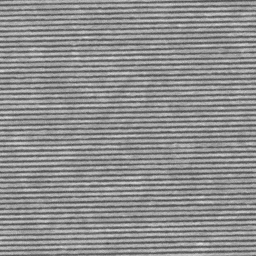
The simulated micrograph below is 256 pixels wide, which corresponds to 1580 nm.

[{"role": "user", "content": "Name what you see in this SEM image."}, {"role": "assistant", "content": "parallel lines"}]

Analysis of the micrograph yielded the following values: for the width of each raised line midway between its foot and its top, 15.4 nm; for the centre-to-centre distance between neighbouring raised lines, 0.0322 microns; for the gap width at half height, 18.5 nanometers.